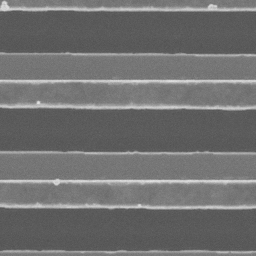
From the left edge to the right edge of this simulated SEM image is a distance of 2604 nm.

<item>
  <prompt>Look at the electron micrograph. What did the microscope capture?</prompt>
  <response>lines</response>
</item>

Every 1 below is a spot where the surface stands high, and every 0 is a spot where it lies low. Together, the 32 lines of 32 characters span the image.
11111111111111111111111111111111
00000000000000000000000000000000
00000000000000000000000000000000
00000000000000000000000000000000
00000000000000000000000000000000
00000000000000000000000000000000
00000000000000000000000000000000
11111111111111111111111111111111
11111111111111111111111111111111
11111111111111111111111111111111
11111111111111111111111111111111
11111111111111111111111111111111
11111111111111111111111111111111
00000000000000000000000001111111
00000000000000000000000000000000
00000000000000000000000000000000
00000000000000000000000000000000
00000000000000000000000000000000
00000000000000000000000000000000
11111111111111111111111111111111
11111111111111111111111111111111
11111111111111111111111111111111
11111111111111111111111111111111
11111111111111111111111111111111
11111111111111111111111111111111
11111111111111111111111111111111
00000000000000000000000000000000
00000000000000000000000000000000
00000000000000000000000000000000
00000000000000000000000000000000
00000000000000000000000000000000
11111111111111111111111111111111